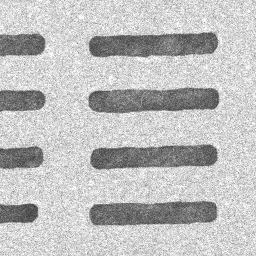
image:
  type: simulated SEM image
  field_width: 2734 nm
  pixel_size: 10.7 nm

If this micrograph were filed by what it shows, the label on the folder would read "holes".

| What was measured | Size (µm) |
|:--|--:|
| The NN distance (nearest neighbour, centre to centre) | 0.596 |